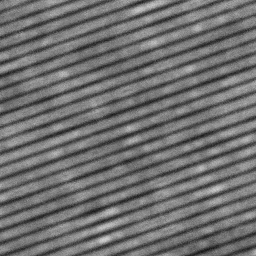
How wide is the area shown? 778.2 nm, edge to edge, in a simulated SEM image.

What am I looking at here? parallel lines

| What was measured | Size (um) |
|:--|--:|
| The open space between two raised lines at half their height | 0.0083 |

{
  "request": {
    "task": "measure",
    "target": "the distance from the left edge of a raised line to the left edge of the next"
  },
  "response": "36.9 nm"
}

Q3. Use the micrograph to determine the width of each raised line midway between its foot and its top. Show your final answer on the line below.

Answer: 27.6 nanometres